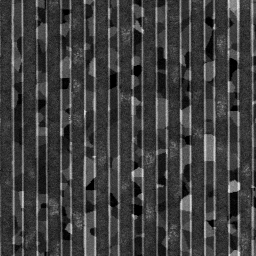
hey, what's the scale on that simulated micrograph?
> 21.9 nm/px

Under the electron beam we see parallel lines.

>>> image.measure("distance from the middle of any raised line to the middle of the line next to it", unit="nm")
526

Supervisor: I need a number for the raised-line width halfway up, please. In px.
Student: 9.38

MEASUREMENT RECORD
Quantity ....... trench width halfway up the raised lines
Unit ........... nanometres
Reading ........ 307